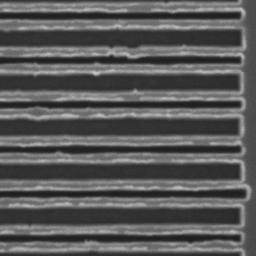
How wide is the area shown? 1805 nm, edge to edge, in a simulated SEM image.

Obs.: parallel lines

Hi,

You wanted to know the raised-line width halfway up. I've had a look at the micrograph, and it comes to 79.4 nanometres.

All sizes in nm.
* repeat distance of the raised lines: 154